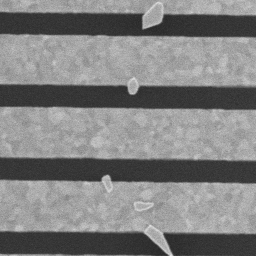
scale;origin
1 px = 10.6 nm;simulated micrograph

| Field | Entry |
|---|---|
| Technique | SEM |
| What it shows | lines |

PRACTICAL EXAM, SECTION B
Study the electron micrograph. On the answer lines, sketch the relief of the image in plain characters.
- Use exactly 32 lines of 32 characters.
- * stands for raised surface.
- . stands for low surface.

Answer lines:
********************************
.*******************************
..................**............
................................
**************..*...............
********************************
********************************
********************************
********************************
********************************
********************************
................*...............
................................
**********......................
********************************
********************************
********************************
********************************
********************************
********************************
................................
................................
.............*..................
********************************
********************************
********************************
********************************
********************************
********************************
..................***...........
....................*...........
................................